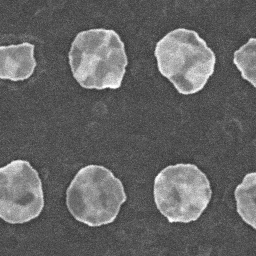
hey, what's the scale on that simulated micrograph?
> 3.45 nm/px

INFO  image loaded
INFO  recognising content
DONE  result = raised bodies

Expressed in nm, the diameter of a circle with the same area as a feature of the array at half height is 201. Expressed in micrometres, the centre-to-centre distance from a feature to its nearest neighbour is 0.3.